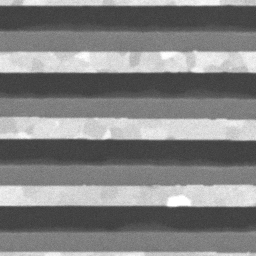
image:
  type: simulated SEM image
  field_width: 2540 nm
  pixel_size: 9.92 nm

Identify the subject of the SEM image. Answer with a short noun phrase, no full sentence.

lines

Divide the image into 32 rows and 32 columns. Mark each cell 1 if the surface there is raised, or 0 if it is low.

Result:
11111111111111111111111111111111
00000000000000000000000000000000
00000000000000000000000000000000
00000000000000000000000000000000
11111111111111111111111111111111
11111111111111111111111111111111
11111111111111111111111111111111
11111111111111111111111111111111
11111111111111111111111111111111
00000000000000000000000000000000
00000000000000000000000000000000
00000000000000000000000000000000
11111111111111111111111111111111
11111111111111111111111111111111
11111111111111111111111111111111
11111111111111111111111111111111
11111111111111111111111111111111
00000000000000000000000000001111
00000000000000000000000000000000
00000000000000000000000000000000
00000000000000000000000000000000
11111111111111111111111111111111
11111111111111111111111111111111
11111111111111111111111111111111
11111111111111111111111111111111
11111111111111111111111111111111
00000000000000000000000000000000
00000000000000000000000000000000
00000000000000000000000000000000
11111111111111111111111111111111
11111111111111111111111111111111
11111111111111111111111111111111